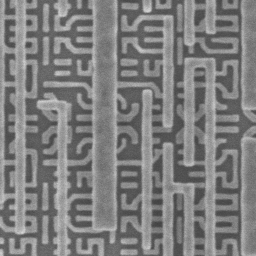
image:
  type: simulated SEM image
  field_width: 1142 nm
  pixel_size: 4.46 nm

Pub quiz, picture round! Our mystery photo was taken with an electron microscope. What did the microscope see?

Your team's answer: wiring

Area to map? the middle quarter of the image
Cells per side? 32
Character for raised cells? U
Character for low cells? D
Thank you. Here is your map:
DDDDDDDUUUUUUDDDDDDDDDDDDUUDDDUU
DDDDDDDUUUUUUDDDDDDDDDDDDUUDDDUU
DDDDDDDUUUUUUDDDDDDDDDDDDUUDDDUU
DDDDDDDUUUUUUDDDDDDDDDDDDUUDDDUU
DDDDDDDUUUUUUDDDDDDDDDDDDUUDDDUU
DDDDDDDUUUUUUDDDDDDDDDDDDUUDDDUU
DDDDDDDUUUUUUDDDDDDDUUDDDUUDDDUU
DDDDDDDUUUUUUDDDDDDDUUDDDUUDDDUU
DDDDDDDUUUUUUDDDDDDDUUDDDUUDDDUU
UDDDDDDUUUUUUDDDDDDDUUDDDUUDDDUU
UDDDDDDUUUUUUDDDDDDDUUDDDUUDDDUU
UDDDDDDUUUUUUDDDDDDDUUDDDUUDDDUU
UDDDDDDUUUUUUDDDDDDDUUDDDUUDDDUU
UDDDDDDUUUUUUDDDDDDDUUDDDUUDDDUU
UDDDDDDUUUUUUDDDDDDDUUDDDUUDDDUU
UDDDDDDUUUUUUDDDDDDDUUDDDUUDDDUU
UDDDDDDUUUUUUDDDDDDDUUDDDDDDDDUU
UDDDDDDUUUUUUDDDDDDDUUDDDDDDDDUU
UDDDDDDUUUUUUDDDDDDDUUDDDDDDDDUU
UDDDDDDUUUUUUDDDDDDUUUDDDDDDDDUU
UDDDDDDUUUUUUDDDDDDUUUDDDUUDDDUU
UDDDDDDUUUUUUDDDDDDUUUDDDUUDDDUU
UDDDDDDUUUUUUDDDDDDUUUDDDUUDDDUU
UDDDDDDUUUUUUDDDDDDDUUDDDUUDDDUU
UDDDDDDUUUUUUDDDDDDDUUDDDUUDDDUU
UDDDDDDUUUUUUDDDDDDUUUDDDUUDDDDD
UDDDDDDUUUUUUDDDDDDUUUDDDUUDDDDD
UDDDDDDUUUUUUDDDDDDUUUDDDUUDDDDD
UDDDDDDUUUUUUDDDDDDDUUDDDUUDDDDD
UDDDDDDUUUUUUDDDDDDDUUDDDUUDDDDD
UDDDDDDUUUUUUDDDDDDDUUDDDUUUUUUU
UDDDDDDUUUUUUDDDDDDDUUDDDUUUUUUU